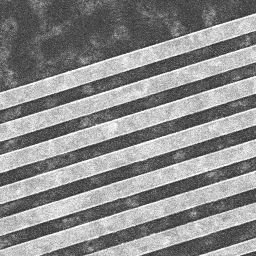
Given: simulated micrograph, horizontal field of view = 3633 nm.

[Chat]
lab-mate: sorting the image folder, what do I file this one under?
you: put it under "parallel lines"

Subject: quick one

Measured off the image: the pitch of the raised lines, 427 nanometers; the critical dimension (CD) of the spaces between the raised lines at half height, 202 nm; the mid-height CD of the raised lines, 225 nm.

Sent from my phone